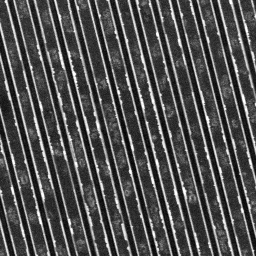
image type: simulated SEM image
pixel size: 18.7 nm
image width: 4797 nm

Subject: parallel lines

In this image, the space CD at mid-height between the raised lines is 5.83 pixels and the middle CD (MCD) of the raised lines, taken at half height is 255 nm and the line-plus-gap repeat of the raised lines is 371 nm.